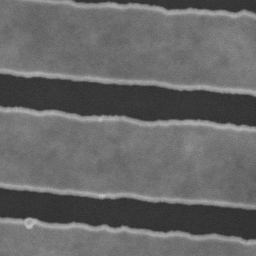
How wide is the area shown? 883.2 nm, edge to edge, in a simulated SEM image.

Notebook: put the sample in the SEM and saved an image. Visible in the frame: lines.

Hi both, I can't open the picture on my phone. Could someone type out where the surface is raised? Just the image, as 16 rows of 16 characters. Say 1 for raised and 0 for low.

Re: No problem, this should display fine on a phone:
1111111111000000
1111111111111111
1111111111111111
1111111111111111
1111111111111111
0000000000011111
0000000000000000
1111111100000000
1111111111111111
1111111111111111
1111111111111111
1111111111111111
0000000001111111
0000000000000000
1111111111000000
1111111111111111